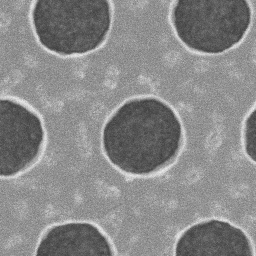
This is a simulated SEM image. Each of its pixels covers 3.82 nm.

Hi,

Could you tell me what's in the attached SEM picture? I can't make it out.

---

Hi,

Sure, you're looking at holes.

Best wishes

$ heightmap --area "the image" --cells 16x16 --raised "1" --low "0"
1100000111100000
1100000111100000
1110000111100001
1111111111111111
1111111111111111
1111111111111111
0111111100111111
0011111000011110
0001110000011110
0011111000011110
0011111100111111
1111111111111111
1111111111111111
1111111111111111
1110001111110001
1100000111100000